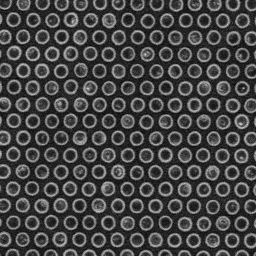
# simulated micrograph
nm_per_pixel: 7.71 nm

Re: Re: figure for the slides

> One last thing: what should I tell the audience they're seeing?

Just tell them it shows a regular array of raised bodies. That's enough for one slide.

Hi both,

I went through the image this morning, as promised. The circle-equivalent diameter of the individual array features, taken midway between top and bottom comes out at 13.8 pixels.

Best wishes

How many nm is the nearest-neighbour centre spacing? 144